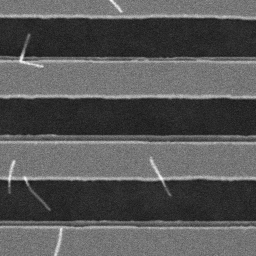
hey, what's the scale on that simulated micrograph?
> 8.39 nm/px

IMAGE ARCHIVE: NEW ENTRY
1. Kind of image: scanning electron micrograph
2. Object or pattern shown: lines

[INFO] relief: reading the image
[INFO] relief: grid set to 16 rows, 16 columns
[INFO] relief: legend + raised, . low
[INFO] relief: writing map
++++++++++++++++
................
................
................
++++++++++++++++
++++++++++++++++
................
................
++++++++++++++++
++++++++++++++++
++++++++++++++++
................
................
................
++++++++++++++++
++++++++++++++++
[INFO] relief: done